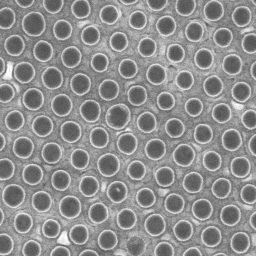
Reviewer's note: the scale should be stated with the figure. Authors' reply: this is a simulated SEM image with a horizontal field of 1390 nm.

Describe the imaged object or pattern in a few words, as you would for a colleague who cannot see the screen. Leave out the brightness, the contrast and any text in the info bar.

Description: a regular array of raised bodies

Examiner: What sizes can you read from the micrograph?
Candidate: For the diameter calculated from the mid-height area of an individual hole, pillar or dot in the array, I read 108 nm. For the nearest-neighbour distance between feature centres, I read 154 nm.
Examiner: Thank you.